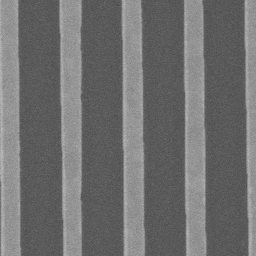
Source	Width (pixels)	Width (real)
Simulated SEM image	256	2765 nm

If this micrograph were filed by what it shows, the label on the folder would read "lines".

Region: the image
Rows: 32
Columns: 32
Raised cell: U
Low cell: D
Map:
UUDDDDDDUUDDDDDUUUDDDDDUUDDDDDDU
UUDDDDDDUUDDDDDUUUDDDDDUUDDDDDDU
UUDDDDDDUUDDDDDUUUDDDDDUUDDDDDDU
UUDDDDDDUUDDDDDUUUDDDDDUUDDDDDDU
UUDDDDDDUUDDDDDUUUDDDDDUUDDDDDDU
UUDDDDDDUUDDDDDUUUDDDDDUUDDDDDDU
UUDDDDDDUUDDDDDUUUDDDDDUUDDDDDDU
UUDDDDDDUUDDDDDUUUDDDDDUUDDDDDDU
UUDDDDDDUUDDDDDUUUDDDDDUUDDDDDDU
UUDDDDDDUUDDDDDUUUDDDDDUUDDDDDDU
UUDDDDDDUUDDDDDUUUDDDDDUUDDDDDDU
UUDDDDDDUUDDDDDUUUDDDDDUUDDDDDDU
UUDDDDDDUUDDDDDUUUDDDDDUUDDDDDDU
UUDDDDDDUUDDDDDUUUDDDDDUUDDDDDDU
UUDDDDDDUUDDDDDUUUDDDDDUUDDDDDDU
UUDDDDDDUUDDDDDUUUDDDDDUUDDDDDDU
UUDDDDDDUUDDDDDDUUDDDDDUUDDDDDDU
UUDDDDDDUUDDDDDDUUDDDDDUUUDDDDDU
UUDDDDDDUUDDDDDDUUDDDDDUUUDDDDDU
UUDDDDDDUUDDDDDDUUDDDDDUUUDDDDDU
UUDDDDDDUUDDDDDDUUDDDDDUUUDDDDDU
UUDDDDDDUUDDDDDDUUDDDDDUUUDDDDDU
UUDDDDDDUUDDDDDDUUDDDDDUUUDDDDDU
UUDDDDDDUUDDDDDDUUDDDDDUUUDDDDDU
UUDDDDDDUUDDDDDDUUDDDDDUUUDDDDDU
UUDDDDDDUUDDDDDDUUDDDDDUUUDDDDDU
UUDDDDDDUUDDDDDDUUDDDDDUUUDDDDDU
UUDDDDDDUUDDDDDDUUDDDDDUUUDDDDDU
UUDDDDDDUUDDDDDDUUDDDDDUUUDDDDDU
UUDDDDDDUUDDDDDDUUDDDDDUUUDDDDDU
UUDDDDDDUUDDDDDDUUDDDDDUUUDDDDDU
UUDDDDDDUUDDDDDDUUDDDDDUUUDDDDDU